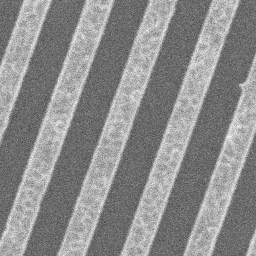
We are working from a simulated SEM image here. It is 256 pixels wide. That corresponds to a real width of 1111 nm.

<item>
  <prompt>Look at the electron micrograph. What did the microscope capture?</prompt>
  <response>parallel lines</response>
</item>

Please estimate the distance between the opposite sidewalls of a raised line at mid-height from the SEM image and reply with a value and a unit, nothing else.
102 nm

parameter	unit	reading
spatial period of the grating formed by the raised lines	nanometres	256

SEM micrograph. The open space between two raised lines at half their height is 35.6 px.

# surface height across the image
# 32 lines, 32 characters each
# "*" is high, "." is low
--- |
...***.....***.....***.....***..
...***....****....****....***...
..***.....***.....***.....***...
..***.....***.....***....****...
..***....****....***.....***....
.***.....***.....***.....***....
.***.....***.....***....***.....
****....***.....***.....***.....
***.....***.....***.....***....*
***.....***....****....***.....*
**.....***.....***.....***....**
**.....***.....***.....***....**
**.....***....***.....***.....**
*.....***.....***.....***.....**
*.....***.....***....****....***
*....****....***.....***.....***
.....***.....***.....***.....***
.....***.....***....****....***.
....***.....***.....***.....***.
....***.....***.....***.....***.
....***....****....***.....***..
...***.....***.....***.....***..
...***.....***.....***....****..
...***....****....***.....***...
..***.....***.....***.....***...
..***.....***.....***....***....
.****....***.....***.....***....
.***.....***.....***.....***....
.***.....***....****....***.....
***.....***.....***.....***.....
***.....***.....***.....***....*
***.....***....***.....***.....*